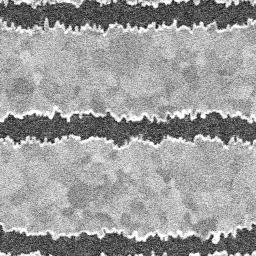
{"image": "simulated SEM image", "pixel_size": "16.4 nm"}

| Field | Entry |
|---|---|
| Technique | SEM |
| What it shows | one or a few lines or trenches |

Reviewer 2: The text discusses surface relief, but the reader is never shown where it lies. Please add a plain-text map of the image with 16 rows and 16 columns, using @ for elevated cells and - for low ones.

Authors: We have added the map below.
----------------
---------------@
@@@@@@@@@@@@@@@@
@@@@@@@@@@@@@@@@
@@@@@@@@@@@@@@@@
@@@@@@@@@@@@@@@@
@@@@@@@@@@@@@@@@
----------------
----------------
@@@@@@@@@@@@@@@@
@@@@@@@@@@@@@@@@
@@@@@@@@@@@@@@@@
@@@@@@@@@@@@@@@@
@@@@@@@@@@@@@@@@
--@@@@@@@@@@@@@-
----------------